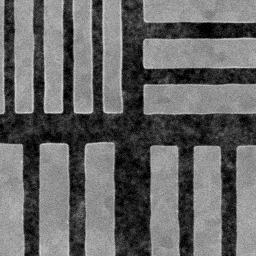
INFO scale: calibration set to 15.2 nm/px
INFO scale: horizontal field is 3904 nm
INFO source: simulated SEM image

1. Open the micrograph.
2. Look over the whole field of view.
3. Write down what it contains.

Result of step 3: groups of lines, slits or small figures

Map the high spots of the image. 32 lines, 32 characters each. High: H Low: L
LLHHLLHHLHHLLHHLLLHHHHHHHHHHHHHH
LLHHLLHHLHHLLHHLLLHHHHHHHHHHHHHH
LLHHLLHHLHHLLHHLLLHHHHHHHHHHHHHH
LLHHLLHHLHHLLHHLLLLLLLLLLLLLLLLL
LLHHLLHHLHHLLHHLLLLLLLLLLLLLLLLL
LLHHLLHHLHHLLHHLLLHHHHHHHHHHHHHH
LLHHLLHHLHHLLHHLLLHHHHHHHHHHHHHH
LLHHLLHHLHHLLHHLLLHHHHHHHHHHHHHH
LLHHLLHHLHHLLHHLLLHHHHLLLLLLLLLL
LLHHLLHHLHHLLHHLLLLLLLLLLLLLLLLL
LLHHLLHHLHHLLHHLLLLLLLLLLLLLLLLL
LLHHLLHHLHHLLHHLLLHHHHHHHHHHHHHH
LLHHLLHHLHHHLHHLLLHHHHHHHHHHHHHH
LLHHLLHHLHHLLHHLLLHHHHHHHHHHHHHH
LLLLLLLLLLLLLLLLLLLLLLLLLLLLLLLL
LLLLLLLLLLLLLLLLLLLLLLLLLLLLLLLL
LLLLLLLLLLLLLLLLLLLLLLLLLLLLLLLL
LLLLLLLLLLLLLLLLLLLLLLLLLLLLLLLL
HHHLLHHHLLLHHHLLLLLHHHLLHHHLLLHH
HHHLLHHHHLLHHHLLLLLHHHLLHHHHLLHH
HHHLLHHHHLLHHHLLLLLHHHLLHHHHLLHH
HHHLLHHHHLLHHHLLLLLHHHLLHHHHLLHH
HHHLLHHHHLLHHHLLLLLHHHLLHHHHLLHH
HHHLLHHHHLLHHHLLLLLHHHLLHHHHLLHH
HHHLLHHHHLLHHHLLLLLHHHLLHHHHLLHH
HHHLLHHHHLLHHHLLLLLHHHLLHHHHLLHH
HHHLLHHHHLLHHHLLLLLHHHLLHHHHLLHH
HHHLLHHHHLLHHHLLLLLHHHLLHHHHLLHH
HHHLLHHHHLLHHHLLLLLHHHLLHHHHLLHH
HHHLLHHHHLLHHHLLLLLHHHLLHHHHLLHH
HHHLLHHHHLLHHHLLLLLHHHLLHHHHLLHH
HHHLLHHHHLLHHHLLLLLHHHLLHHHHLLHH